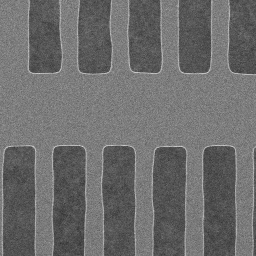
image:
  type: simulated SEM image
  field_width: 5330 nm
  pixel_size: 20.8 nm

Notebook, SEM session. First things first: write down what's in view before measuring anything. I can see groups of lines, slits or small figures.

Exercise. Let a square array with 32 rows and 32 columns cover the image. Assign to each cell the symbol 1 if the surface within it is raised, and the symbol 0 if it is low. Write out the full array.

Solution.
11110001110000110000110000011000
11110000110000110000110000111000
11110000110000110000110000111000
11110000110000110000110000111000
11110000110000110000110000111000
11110000110000110000110000111000
11110000110000110000110000111000
11110000110000110000110000111000
11110000110000110000110000111000
11111111111111111111111111111111
11111111111111111111111111111111
11111111111111111111111111111111
11111111111111111111111111111111
11111111111111111111111111111111
11111111111111111111111111111111
11111111111111111111111111111111
11111111111111111111111111111111
11111111111111111111111111111111
10001110001110000111000111000111
00001110000110000110000110000011
00001110000110000110000110000011
00001110000110000110000110000011
00001110000110000110000110000011
00000110000110000110000110000111
00000110000110000110000110000111
00000110000110000110000110000111
00000110000110000110000110000011
00001100000110000110000110000011
00001110000110000110000110000011
00001110000110000110000110000011
00001110000110000110000110000111
00001110000110000110000110000111